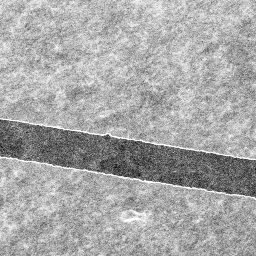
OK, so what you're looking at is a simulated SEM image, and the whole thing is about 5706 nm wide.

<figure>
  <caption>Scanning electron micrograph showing one or a few lines or trenches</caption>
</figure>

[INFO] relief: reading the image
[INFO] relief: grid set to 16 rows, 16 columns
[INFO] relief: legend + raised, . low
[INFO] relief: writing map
................
................
................
................
................
................
................
+...............
+++++++.........
+++++++++++++...
....++++++++++++
.........+++++++
................
........+.......
................
................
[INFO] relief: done